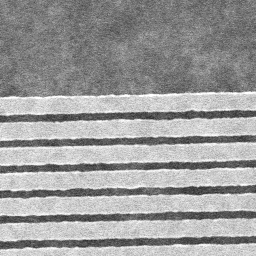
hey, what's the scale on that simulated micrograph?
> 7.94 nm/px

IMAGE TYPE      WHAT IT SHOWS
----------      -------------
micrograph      parallel lines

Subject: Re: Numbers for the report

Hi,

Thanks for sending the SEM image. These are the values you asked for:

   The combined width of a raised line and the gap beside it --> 0.2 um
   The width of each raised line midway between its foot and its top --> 0.132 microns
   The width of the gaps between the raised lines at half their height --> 66.5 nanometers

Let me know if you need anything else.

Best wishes